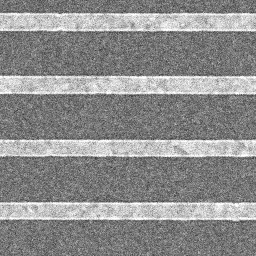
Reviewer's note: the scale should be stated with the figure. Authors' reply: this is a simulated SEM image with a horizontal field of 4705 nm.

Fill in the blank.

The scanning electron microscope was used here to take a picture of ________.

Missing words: one or a few lines or trenches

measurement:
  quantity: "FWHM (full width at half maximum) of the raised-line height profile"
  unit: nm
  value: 290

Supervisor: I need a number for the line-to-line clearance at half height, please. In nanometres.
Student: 866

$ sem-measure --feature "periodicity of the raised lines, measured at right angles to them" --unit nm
1160